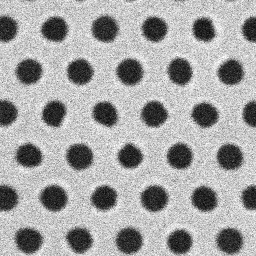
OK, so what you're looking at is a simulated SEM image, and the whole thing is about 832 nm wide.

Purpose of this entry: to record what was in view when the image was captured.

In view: a regular array of holes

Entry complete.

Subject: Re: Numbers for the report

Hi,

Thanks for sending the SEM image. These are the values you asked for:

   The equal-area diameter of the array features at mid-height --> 0.0841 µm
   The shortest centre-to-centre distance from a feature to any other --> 159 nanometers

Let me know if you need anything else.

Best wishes